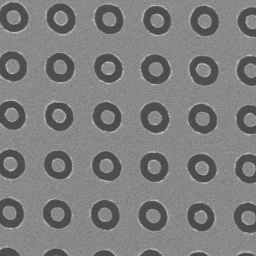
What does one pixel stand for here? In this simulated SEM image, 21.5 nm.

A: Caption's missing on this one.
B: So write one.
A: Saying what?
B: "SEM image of a regular array of ring-shaped grooves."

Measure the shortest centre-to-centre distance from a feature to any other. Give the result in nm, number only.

1020